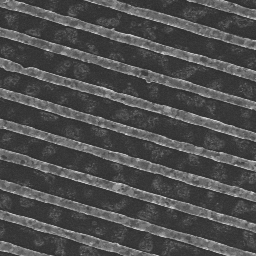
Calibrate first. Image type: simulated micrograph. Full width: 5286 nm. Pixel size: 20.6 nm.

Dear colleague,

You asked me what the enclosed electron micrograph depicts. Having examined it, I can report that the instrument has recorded parallel lines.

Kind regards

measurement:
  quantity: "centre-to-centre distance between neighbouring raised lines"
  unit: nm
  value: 604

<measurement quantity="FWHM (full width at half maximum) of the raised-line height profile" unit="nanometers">181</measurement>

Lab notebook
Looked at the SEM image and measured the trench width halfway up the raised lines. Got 416 nm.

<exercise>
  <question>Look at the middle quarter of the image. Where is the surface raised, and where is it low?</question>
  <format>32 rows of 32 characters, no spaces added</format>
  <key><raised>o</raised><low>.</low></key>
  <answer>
.........ooooooo................
............ooooooooo...........
................oooooooo........
o...................ooooooo.....
oooo.................oooooooooo.
oooooooo..................oooooo
...ooooooooo..................oo
.......oooooooo.................
...........ooooooo..............
..............ooooooo...........
.................ooooooooo......
oo...................ooooooo....
oooooo...................ooooooo
..ooooooo..................ooooo
.....ooooooo...................o
........ooooooo.................
............oooooooo............
...............oooooooo.........
o..................ooooooo......
ooo...................ooooooo...
ooooooo...................oooooo
...oooooooo..................ooo
.......ooooooo..................
.........ooooooooo..............
.............oooooooo...........
................ooooooooo.......
o...................oooooooo....
oooooo..................oooooooo
.oooooooo..................ooooo
....oooooooo..................oo
........oooooooo................
...........oooooooo.............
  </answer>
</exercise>